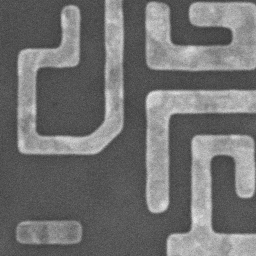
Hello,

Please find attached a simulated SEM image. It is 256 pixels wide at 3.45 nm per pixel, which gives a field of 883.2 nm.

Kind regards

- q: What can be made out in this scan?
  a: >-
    wiring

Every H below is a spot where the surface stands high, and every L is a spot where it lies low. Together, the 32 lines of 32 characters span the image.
LLLLLLLLLLLLLHHLLLLHLLLLHHHHHHHH
LLLLLLLLHHLLLHHLLLHHHLLLHHHHHHHH
LLLLLLLLHHLLLHHLLLHHHLLLHHHHHHHH
LLLLLLLLHHLLLHHLLLHHHLLLLLLLLHHH
LLLLLLLLHHLLLHHLLLHHHLLLLLLLLHHH
LLLLLLLLHHLLLHHLLLHHHHLLLLLLLHHH
LLLHHHHHHHLLLHHLLLHHHHHHHHHHHHHH
LLHHHHHHHHLLLHHLLLHHHHHHHHHHHHHH
LLHHHLLLLLLLLHHLLLLHHHHHHHHHHHHH
LLHHLLLLLLLLLHHLLLLLLLLLLLLLLLLL
LLHHLLLLLLLLLHHLLLLLLLLLLLLLLLLL
LLHHLLLLLLLLLHHLLLLHHHHHHHHHHHHH
LLHHLLLLLLLLLHHLLLHHHHHHHHHHHHHH
LLHHLLLLLLLLLHHLLLHHHHHHHHHHHHHH
LLHHLLLLLLLLLHHLLLHHHLLLLLLLLLLL
LLHHLLLLLLLLLHHLLLHHHLLLLLLLLLLL
LLHHLLLLLLLLHHHLLLHHHLLLLLLLLLLL
LLHHHHHHHHHHHHLLLLHHHLLLHHHHHHHH
LLHHHHHHHHHHHLLLLLHHHLLLHHHHHHHH
LLLLLLLLLLLLLLLLLLHHHLLLHHHLLHHH
LLLLLLLLLLLLLLLLLLHHHLLLHHLLLLHH
LLLLLLLLLLLLLLLLLLHHHLLLHHLLLLHH
LLLLLLLLLLLLLLLLLLHHHLLLHHLLLLHH
LLLLLLLLLLLLLLLLLLHHHLLLHHLLLLHH
LLLLLLLLLLLLLLLLLLHHHLLLHHLLLLHL
LLLLLLLLLLLLLLLLLLHHHLLLHHLLLLLL
LLLLLLLLLLLLLLLLLLLLLLLLHHLLLLLL
LLLLLLLLLLLLLLLLLLLLLLLLHHLLLLLL
LLHHHHHHHHLLLLLLLLLLLLLLHHLLLLLL
LLHHHHHHHHLLLLLLLLLLLHHHHHHHHHHH
LLLLLLLLLLLLLLLLLLLLLHHHHHHHHHHH
LLLLLLLLLLLLLLLLLLLLLHHHHHHHHHHH